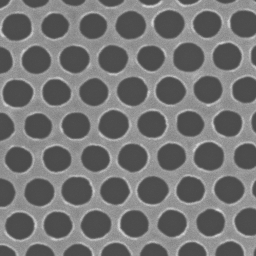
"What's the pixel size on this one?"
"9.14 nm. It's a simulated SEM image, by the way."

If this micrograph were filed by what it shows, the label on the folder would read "a regular array of holes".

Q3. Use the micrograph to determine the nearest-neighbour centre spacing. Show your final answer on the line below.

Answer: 344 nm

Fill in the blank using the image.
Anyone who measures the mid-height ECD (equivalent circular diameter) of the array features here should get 260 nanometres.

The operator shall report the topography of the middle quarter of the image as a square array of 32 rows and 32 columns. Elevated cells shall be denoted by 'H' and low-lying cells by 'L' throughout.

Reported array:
LLLLLLHHHLLLLLLHHHHLLLLLHHHHLLLL
HLLLLHHHHHLLLLHHHHHHLLLHHHHHHLLL
HHHHHHHHHHHHHHHHHHHHHHHHHHHHHHHH
HHHHHHHLLHHHHHHHLLLHHHHHHLLLHHHH
HHHHHLLLLLHHHHLLLLLLHHHHLLLLLHHH
LHHHLLLLLLLHHLLLLLLLLHHLLLLLLLHH
LLHHLLLLLLLHHLLLLLLLLHHLLLLLLLLH
LLHHLLLLLLLHHLLLLLLLLHHLLLLLLLHH
LLHHLLLLLLLHHHLLLLLLLHHLLLLLLLHH
LHHHHLLLLLHHHHLLLLLLHHHHLLLLLHHH
HHHHHHHLHHHHHHHHLLHHHHHHHHHHHHHH
HHHHHHHHHHHHLHHHHHHHHHHHHHHHHHHH
HLLLLHHHHHLLLLLHHHHLLLLLHHHHHLLL
LLLLLLHHHLLLLLLLHHHLLLLLLHHHLLLL
LLLLLLHHHLLLLLLLHHLLLLLLLHHHLLLL
LLLLLLLHLLLLLLLLHHLLLLLLLLHHLLLL
LLLLLLHHHLLLLLLLHHHLLLLLLHHHLLLL
LLLLLLHHHLLLLLLHHHHHLLLLLHHHHLLL
HLLLLHHHHHHLLLHHHHHHHHLHHHHHHHHH
HHHHHHHHHHHHHHHHHHHHHHHHHHHHHHHH
HHHHHHLLLHHHHHHLLLLHHHHHLLLLLHHH
LHHHHLLLLLHHHHLLLLLLHHHHLLLLLLHH
LLHHLLLLLLLHHHLLLLLLLHHLLLLLLLHH
LLHHLLLLLLLHHLLLLLLLLHHLLLLLLLLH
LLHHHLLLLLLHHHLLLLLLLHHLLLLLLLHH
LHHHHLLLLLLHHHLLLLLLHHHHLLLLLHHH
HHHHHHLLLLHHHHHHLLLHHHHHHHLLHHHH
HHHHHHHHHHHHHHHHHHHHHHHHHHHHHHHH
HLLLLHHHHHHLLLHHHHHHLLLLHHHHHHLL
LLLLLLHHHHLLLLLLHHHLLLLLLHHHHLLL
LLLLLLLHHLLLLLLLHHHLLLLLLLHHLLLL
LLLLLLLHHLLLLLLLHHLLLLLLLLHHLLLL